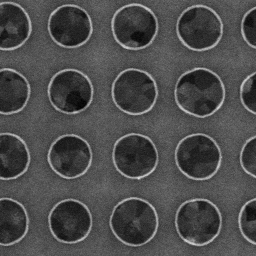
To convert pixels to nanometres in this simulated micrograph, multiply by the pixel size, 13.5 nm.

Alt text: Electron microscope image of a regular array of raised bodies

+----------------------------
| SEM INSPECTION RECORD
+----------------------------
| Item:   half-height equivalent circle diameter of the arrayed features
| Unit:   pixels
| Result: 44.4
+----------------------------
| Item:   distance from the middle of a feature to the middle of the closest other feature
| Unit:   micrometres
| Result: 0.863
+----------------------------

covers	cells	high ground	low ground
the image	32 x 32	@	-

@@------------------------------
@@@----@@@@----@@@@----@@@@----@
@@@@--@@@@@---@@@@@@--@@@@@---@@
@@@@--@@@@@---@@@@@@--@@@@@@--@@
@@@@--@@@@@---@@@@@---@@@@@@--@@
@@@----@@@-----@@@@----@@@@----@
--------------------------------
--------------------------------
--------------------------------
@@@----@@@@----@@@@----@@@@----@
@@@---@@@@@---@@@@@---@@@@@@--@@
@@@@--@@@@@---@@@@@@--@@@@@@--@@
@@@---@@@@@---@@@@@---@@@@@@--@@
@@@----@@@@----@@@@----@@@@----@
-------------------------@------
--------------------------------
--------------------------------
@@@----@@@-----@@@@----@@@@----@
@@@---@@@@@---@@@@@---@@@@@---@@
@@@@--@@@@@---@@@@@@--@@@@@---@@
@@@---@@@@@---@@@@@@--@@@@@---@@
@@@----@@@-----@@@@----@@@@----@
--------------------------------
--------------------------------
--------------------------------
@@-----@@@-----@@@@----@@@@----@
@@@---@@@@@---@@@@@---@@@@@---@@
@@@---@@@@@---@@@@@@--@@@@@@--@@
@@@---@@@@@---@@@@@@--@@@@@---@@
@@@----@@@@----@@@@----@@@@----@
@---------------@@------@-------
--------------------------------